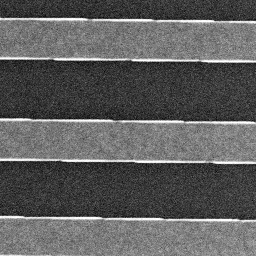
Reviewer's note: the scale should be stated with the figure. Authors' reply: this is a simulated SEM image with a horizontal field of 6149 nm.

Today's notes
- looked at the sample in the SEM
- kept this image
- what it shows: lines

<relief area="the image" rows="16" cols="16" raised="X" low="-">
----------------
XXXXXXXXXXXXXXXX
XXXXXXXXXXXXXXXX
XXXXXXXXXXXXXXXX
----------------
----------------
----------------
XX--------------
XXXXXXXXXXXXXXXX
XXXXXXXXXXXXXXXX
----------------
----------------
----------------
----------------
XXXXXXXXXXXXXXXX
XXXXXXXXXXXXXXXX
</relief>